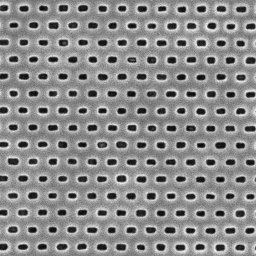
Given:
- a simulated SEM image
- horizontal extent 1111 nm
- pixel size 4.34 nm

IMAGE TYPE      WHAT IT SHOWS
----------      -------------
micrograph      a regular array of holes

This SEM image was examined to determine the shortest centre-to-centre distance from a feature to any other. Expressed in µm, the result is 0.0832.